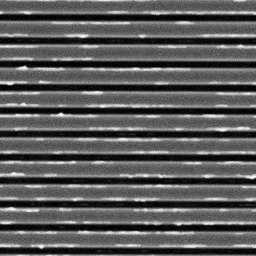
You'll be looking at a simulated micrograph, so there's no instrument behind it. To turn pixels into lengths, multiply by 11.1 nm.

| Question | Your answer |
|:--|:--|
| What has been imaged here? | parallel lines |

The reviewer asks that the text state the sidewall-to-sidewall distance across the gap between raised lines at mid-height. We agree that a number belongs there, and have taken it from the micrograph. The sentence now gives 79.1 nanometres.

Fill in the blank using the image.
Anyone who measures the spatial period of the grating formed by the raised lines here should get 23.3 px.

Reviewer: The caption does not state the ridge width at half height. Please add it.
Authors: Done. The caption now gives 176 nanometers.